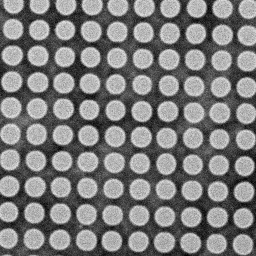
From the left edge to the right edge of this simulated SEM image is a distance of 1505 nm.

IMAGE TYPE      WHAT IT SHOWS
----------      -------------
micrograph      an array of small figures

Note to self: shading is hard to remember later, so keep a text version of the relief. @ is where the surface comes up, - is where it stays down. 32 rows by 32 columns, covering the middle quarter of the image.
------@@----@@@---@@@---@@@@---@
--------------------------------
@-------------------------------
@@---@@@---@@@@---@@@----@@@---@
@@--@@@@@--@@@@--@@@@@--@@@@--@@
@@--@@@@@--@@@@--@@@@@--@@@@--@@
@@---@@@---@@@@---@@@---@@@@--@@
-------------------------@@----@
--------------------------------
@@---@@@----@@------------------
@@--@@@@---@@@@--@@@@@--@@@@---@
@@--@@@@@--@@@@--@@@@@--@@@@--@@
@@--@@@@---@@@@--@@@@@--@@@@--@@
@----@@@---@@@----@@@---@@@@---@
--------------------------------
--------------------------------
@@--@@@@---@@@@---@@@---@@@----@
@@--@@@@--@@@@@--@@@@@--@@@@--@@
@@--@@@@--@@@@@--@@@@@-@@@@@--@@
@---@@@@---@@@@--@@@@--@@@@@--@@
------------@@----@@----@@@----@
--------------------------------
@----@@-----@@------------------
@@--@@@@--@@@@@--@@@@---@@@----@
@@--@@@@--@@@@@--@@@@--@@@@@--@@
@@--@@@@--@@@@@--@@@@--@@@@@--@@
-----@@----@@@---@@@@---@@@---@@
--------------------------------
--------------------------------
@---@@@@---@@@---@@@@---@@@----@
@@--@@@@--@@@@@--@@@@--@@@@@--@@
@@--@@@@--@@@@@--@@@@--@@@@@--@@